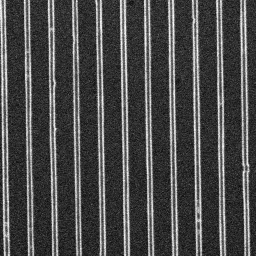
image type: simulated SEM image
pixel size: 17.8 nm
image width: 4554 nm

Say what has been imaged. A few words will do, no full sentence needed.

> parallel lines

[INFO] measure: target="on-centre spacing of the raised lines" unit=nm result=427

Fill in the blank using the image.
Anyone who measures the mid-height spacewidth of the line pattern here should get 0.351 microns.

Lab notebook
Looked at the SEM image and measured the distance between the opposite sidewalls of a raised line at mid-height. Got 80 nm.